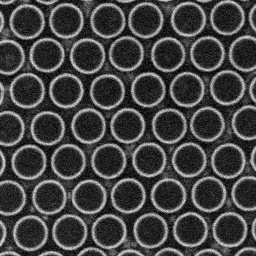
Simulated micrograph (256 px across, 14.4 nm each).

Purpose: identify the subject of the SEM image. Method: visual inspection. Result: a regular array of raised bodies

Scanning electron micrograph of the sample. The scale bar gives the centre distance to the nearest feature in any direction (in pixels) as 39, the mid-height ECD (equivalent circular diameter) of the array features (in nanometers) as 481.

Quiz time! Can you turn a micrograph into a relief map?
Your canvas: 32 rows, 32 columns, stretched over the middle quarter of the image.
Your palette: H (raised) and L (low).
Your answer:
LLLHHHHHHLLLLHHHHHLLLLLHHHHHHLLL
LLLLHHHHLLLLLLLHHLLLLLLLHHHLLLLL
LLLLLLLLLLLLLLLLLLLLLLLLLLLLLHHH
HHHLLLLLHHHHHLLLLLHHHHHHLLLLHHHH
HHHHLLLHHHHHHHLLLLHHHHHHHLLHHHHH
HHHHLLLHHHHHHHHLLHHHHHHHHLLHHHHH
HHHHHLLHHHHHHHHLLHHHHHHHHLLHHHHH
HHHHHLLHHHHHHHHLLHHHHHHHHLLHHHHH
HHHHLLLHHHHHHHLLLLHHHHHHHLLHHHHH
HHHLLLLLHHHHHHLLLLHHHHHLLLLLHHHH
HLLLLLLLLHHHHLLLLLLLLLLLLLLLLLHL
LLLLLHHLLLLLLLLHHLLLLLLLLLLHLLLL
LLLHHHHHHLLLLHHHHHHLLLLHHHHHHLLL
LLLHHHHHHHLLHHHHHHHLLLLHHHHHHHLL
LLHHHHHHHHLLHHHHHHHHLLHHHHHHHHLL
LLHHHHHHHHLLHHHHHHHHLLHHHHHHHHLL
LLHHHHHHHHLLHHHHHHHHLLHHHHHHHHLL
LLLHHHHHHHLLHHHHHHHLLLLHHHHHHHLL
LLLHHHHHHLLLLHHHHHHLLLLLHHHHHLLL
LLLLLHHLLLLLLLLLLLLLLLLLLHHHLLLL
HHLLLLLLLLHHHLLLLLLHHHHLLLLLLHHH
HHHHLLLLHHHHHHLLLLHHHHHHHLLLHHHH
HHHHHLLLHHHHHHHLLHHHHHHHHLLLHHHH
HHHHHLLHHHHHHHHLLHHHHHHHHLLHHHHH
HHHHHLLHHHHHHHHLLHHHHHHHHLLHHHHH
HHHHHLLHHHHHHHHLLLHHHHHHHLLLHHHH
HHHHHLLLHHHHHHHLLLHHHHHHLLLLHHHH
HHHHLLLLLHHHHHLLLLLHHHHLLLLLLHHH
LLLLLLLLLLLLLLLLLLLLLLLLLLLLLLLL
LLLLLHHHLLLLLLHHHHLLLLLLHHHHLLLL
LLLHHHHHHLLLLHHHHHHLLLLHHHHHHLLL
LLLHHHHHHHLLHHHHHHHHLLHHHHHHHHLL